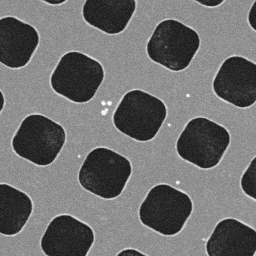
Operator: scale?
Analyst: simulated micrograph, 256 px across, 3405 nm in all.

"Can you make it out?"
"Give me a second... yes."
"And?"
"holes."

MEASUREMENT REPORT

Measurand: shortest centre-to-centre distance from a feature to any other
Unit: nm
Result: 946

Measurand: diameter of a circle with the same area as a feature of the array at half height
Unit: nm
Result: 664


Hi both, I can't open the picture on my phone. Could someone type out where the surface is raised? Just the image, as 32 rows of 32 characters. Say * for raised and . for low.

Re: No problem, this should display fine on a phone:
***********......********..*****
**********.......**************.
...********.....*****.*********.
....********....****....********
.....**************......*******
.....*************.......*******
....*****.********.......*******
....****....*******.....****...*
*******......********..*****....
******.......**************.....
******.......**************.....
*******.....****..*********.....
*********..****.....********....
***************......***********
****.*********.......***********
***....*******......***....*****
**......*******.....***.....****
**......*********..***.......***
**......****.*********......****
**.....****....********.....****
****..****......********...****.
**********......***************.
**********......**************..
..*********....****...********..
...*********...***.....********.
....**************......********
....*************.......********
...****...********.....*****.***
...***.....********....****....*
*****.......**************......
*****.......**************......
*****......****...********......